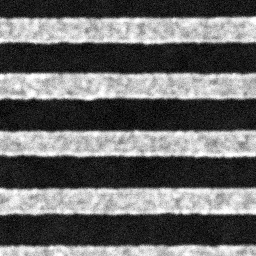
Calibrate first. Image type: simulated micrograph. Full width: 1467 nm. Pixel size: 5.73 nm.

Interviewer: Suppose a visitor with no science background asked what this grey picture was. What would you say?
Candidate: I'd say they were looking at lines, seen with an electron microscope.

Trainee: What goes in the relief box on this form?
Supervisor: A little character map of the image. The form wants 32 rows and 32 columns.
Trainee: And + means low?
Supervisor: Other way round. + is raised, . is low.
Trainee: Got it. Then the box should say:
................................
................................
...............+.......+...+++++
++++++++++++++++++++++++++++++++
++++++++++++++++++++++++++++++++
................................
................................
................................
................................
++++++++++++++++.++++++++..+++.+
++++++++++++++++++++++++++++++++
++++++++++++++++++++++++++++++++
................................
................................
................................
................................
................................
++++++++++++++++++++++++++++++++
++++++++++++++++++++++++++++++++
................................
................................
................................
................................
................................
++++++++++++++++++++++++++++++++
++++++++++++++++++++++++++++++++
++++++++++++++++++++++++.+++++++
................................
................................
................................
................................
++++++++++++++++++++++++++++++++